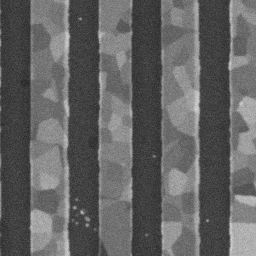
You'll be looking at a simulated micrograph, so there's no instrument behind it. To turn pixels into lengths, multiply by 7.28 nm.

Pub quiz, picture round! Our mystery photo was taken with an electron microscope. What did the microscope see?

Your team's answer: lines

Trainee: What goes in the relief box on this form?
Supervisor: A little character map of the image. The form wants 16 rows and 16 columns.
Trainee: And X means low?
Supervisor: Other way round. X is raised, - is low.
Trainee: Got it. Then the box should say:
--XX--XX--XX--XX
--XX--XX--XX--XX
--XX--XX--XX--XX
--XX--XX--XX--XX
--XX--XX--XX--XX
--XX--XX--XX--XX
--XX--XX--XX--XX
--XX--XX--XX--XX
--XX--XX--XX--XX
--XX--XX--XX--XX
--XX--XX--XX--XX
--XX--XX--XX--XX
--XX--XX--XX--XX
--XX--XX--XX--XX
--XX--XX--XX--XX
--XX--XX--XX--XX